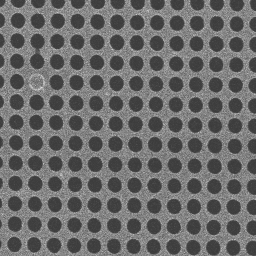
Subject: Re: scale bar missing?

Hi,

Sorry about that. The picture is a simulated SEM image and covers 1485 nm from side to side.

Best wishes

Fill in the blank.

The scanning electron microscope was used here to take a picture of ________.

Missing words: a regular array of holes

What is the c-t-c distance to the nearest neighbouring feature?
115 nanometres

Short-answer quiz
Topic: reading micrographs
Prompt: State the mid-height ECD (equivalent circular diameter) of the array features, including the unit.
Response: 0.0868 microns